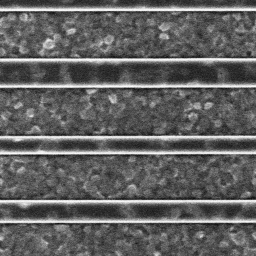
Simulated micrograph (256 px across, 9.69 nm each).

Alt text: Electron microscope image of one or a few lines or trenches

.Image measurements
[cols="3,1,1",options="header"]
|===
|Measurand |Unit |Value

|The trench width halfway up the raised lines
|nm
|469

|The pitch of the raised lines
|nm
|671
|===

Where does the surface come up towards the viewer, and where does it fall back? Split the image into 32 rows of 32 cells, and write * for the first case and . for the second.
********************************
................................
................................
................................
................................
................................
................................
********************************
********************************
********************************
********************************
................................
................................
................................
................................
................................
................................
********************************
********************************
................................
................................
................................
................................
................................
................................
********************************
********************************
********************************
................................
................................
................................
................................